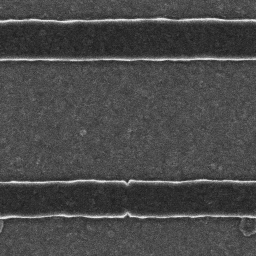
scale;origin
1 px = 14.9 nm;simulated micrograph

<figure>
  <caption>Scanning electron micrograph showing one or a few lines or trenches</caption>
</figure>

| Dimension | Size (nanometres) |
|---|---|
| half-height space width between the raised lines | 1810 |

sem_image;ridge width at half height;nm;563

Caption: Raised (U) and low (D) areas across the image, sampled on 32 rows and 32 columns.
DDDDDDDDDDDDDDDDDDDDDDDDDDDDDDDD
DDDDDDDDDDDDDDDDDDDDDDDDDDDDDDDD
DDDDUDDDDDDDDDDDDUUUUUDUUUUUUDDD
UUUUUUUUUUUUUUUUUUUUUUUUUUUUUUUU
UUUUUUUUUUUUUUUUUUUUUUUUUUUUUUUU
UUUUUUUUUUUUUUUUUUUUUUUUUUUUUUUU
UUUUUUUUUUUUUUUUUUUUUUUUUUUUUUUU
DDDDDDDDDDDDDDDDUDDDDDDDDDDDDDDD
DDDDDDDDDDDDDDDDDDDDDDDDDDDDDDDD
DDDDDDDDDDDDDDDDDDDDDDDDDDDDDDDD
DDDDDDDDDDDDDDDDDDDDDDDDDDDDDDDD
DDDDDDDDDDDDDDDDDDDDDDDDDDDDDDDD
DDDDDDDDDDDDDDDDDDDDDDDDDDDDDDDD
DDDDDDDDDDDDDDDDDDDDDDDDDDDDDDDD
DDDDDDDDDDDDDDDDDDDDDDDDDDDDDDDD
DDDDDDDDDDDDDDDDDDDDDDDDDDDDDDDD
DDDDDDDDDDDDDDDDDDDDDDDDDDDDDDDD
DDDDDDDDDDDDDDDDDDDDDDDDDDDDDDDD
DDDDDDDDDDDDDDDDDDDDDDDDDDDDDDDD
DDDDDDDDDDDDDDDDDDDDDDDDDDDDDDDD
DDDDDDDDDDDDDDDDDDDDDDDDDDDDDDDD
DDDDDDDDDDDDDDDDDDDDDDDDDDDDDDDD
DDDDDDDDDDDDDDDDDDDDDDDDDDDDDDDD
UUUUUUUUUUUUUUUUUUUUUUUUUUUUUUUU
UUUUUUUUUUUUUUUUUUUUUUUUUUUUUUUU
UUUUUUUUUUUUUUUUUUUUUUUUUUUUUUUU
UUUUUUUUUUUUUUUUUUUUUUUUUUUUUUUU
DDDDDDDDDDDDDDDDDDDDDDDDDDDDDDDD
DDDDDDDDDDDDDDDDDDDDDDDDDDDDDDDD
DDDDDDDDDDDDDDDDDDDDDDDDDDDDDDDD
DDDDDDDDDDDDDDDDDDDDDDDDDDDDDDDD
DDDDDDDDDDDDDDDDDDDDDDDDDDDDDDDD